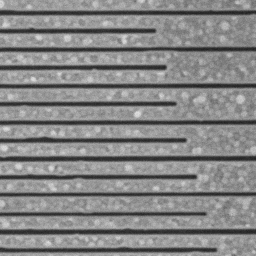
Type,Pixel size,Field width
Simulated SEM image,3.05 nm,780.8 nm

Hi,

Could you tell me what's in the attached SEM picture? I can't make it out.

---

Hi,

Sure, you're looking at parallel lines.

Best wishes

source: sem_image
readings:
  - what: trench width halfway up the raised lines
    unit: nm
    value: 13.7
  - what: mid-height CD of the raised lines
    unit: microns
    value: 0.0408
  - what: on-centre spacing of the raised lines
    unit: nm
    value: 55.8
